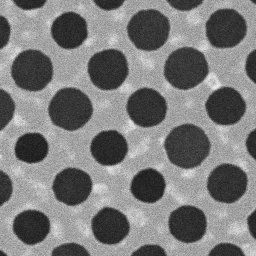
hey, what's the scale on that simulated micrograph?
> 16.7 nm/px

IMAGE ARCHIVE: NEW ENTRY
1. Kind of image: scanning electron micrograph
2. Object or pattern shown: a regular array of holes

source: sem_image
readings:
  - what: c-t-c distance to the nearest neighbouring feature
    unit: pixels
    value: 54.5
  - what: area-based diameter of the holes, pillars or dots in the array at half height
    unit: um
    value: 0.67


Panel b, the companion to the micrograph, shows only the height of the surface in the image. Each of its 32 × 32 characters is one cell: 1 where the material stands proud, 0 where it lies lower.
11000011111100011111100001111111
11111111011111111000111111100011
01111110000111110000011111000001
01111100000111110000011111000001
01111100000111110000011111000001
01111110001111111000011111000011
11100111111100011111110001111110
11000011111000001111100000111110
10000001111000001111000000111110
10000001111000001111100000111110
11000011111100011111100001111111
01111110001111111000111111100011
00111100000111110000011111000001
00111100000011110000011111000001
00111100000111110000011111000011
01111110000111111000111011100111
11111111111110011111100000111110
11000011111100001111100000111110
11000011111000001111100000111110
11000011111100001111100000111110
11111111111100011111110001110111
01111110000111111000111111000001
01111110000111111000011111000001
00111100000011110000011111000001
01111110000111111000111111000011
11111111001111111111111111111111
11100111111100011111100001111111
11000011111000001111100000111110
11000011111000001111100000111110
11000011111100001111110001111110
11100111001110111111111111100111
01111100000111111000011111000011